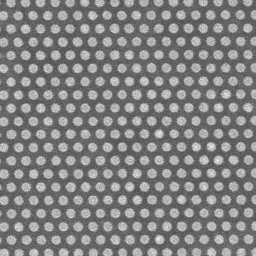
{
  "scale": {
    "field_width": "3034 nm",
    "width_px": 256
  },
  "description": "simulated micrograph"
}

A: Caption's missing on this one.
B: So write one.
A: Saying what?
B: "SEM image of a regular array of raised bodies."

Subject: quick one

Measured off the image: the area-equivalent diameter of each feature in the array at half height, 105 nm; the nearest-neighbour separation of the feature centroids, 0.172 microns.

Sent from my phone